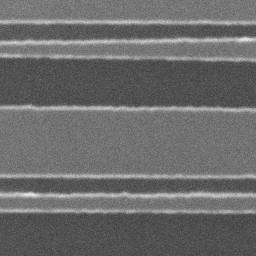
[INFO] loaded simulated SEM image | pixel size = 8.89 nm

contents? lines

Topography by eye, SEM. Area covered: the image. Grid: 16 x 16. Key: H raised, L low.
HHHHHHHHHHHHHHHH
HHHHHHHHHHHHHHHH
HHHHHHHHHHHHHHHH
HHHHHHHHHHHHHHHH
LLLLLLLLLLLLLLLL
LLLLLLLLLLLLLLLL
LLLLLLLLLLLLLLLL
HHHHHHHHHHHHHHHH
HHHHHHHHHHHHHHHH
HHHHHHHHHHHHHHHH
HHHHHHHHHHHHHHHH
HHHHHHHHHHHHHHHH
HHHHHHHHHHHHHHHH
LLLLLLLLLLLLLLLL
LLLLLLLLLLLLLLLL
LLLLLLLLLLLLLLLL